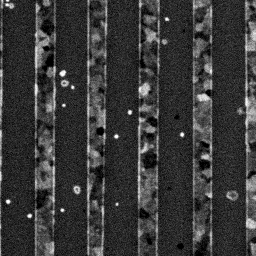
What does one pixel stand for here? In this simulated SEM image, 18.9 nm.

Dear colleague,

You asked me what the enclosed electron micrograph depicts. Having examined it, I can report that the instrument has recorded lines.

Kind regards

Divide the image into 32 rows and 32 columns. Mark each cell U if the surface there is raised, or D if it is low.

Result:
DDDDDUUDDDDUUDDDDDUUDDDDUUDDDDDU
DDDDDUUDDDDUUDDDDDUUDDDDUUDDDDDU
DDDDDUUDDDDUUDDDDDUUDDDDUUDDDDDU
DDDDDUUDDDDUUDDDDDUUDDDDUUDDDDDU
DDDDDUUDDDDUUDDDDDUUDDDDUUDDDDDU
DDDDDUUDDDDUUDDDDDUUDDDDUUDDDDDU
DDDDDUUDDDDUUDDDDDUUDDDDUUDDDDDU
DDDDDUUDDDDUUDDDDDUUDDDDUUDDDDDU
DDDDDUUDDDDUUDDDDDUUDDDDUUDDDDDU
DDDDDUUDDDDUUDDDDDUUDDDDUUDDDDDU
DDDDDUUDDDDUUDDDDDUUDDDDUUDDDDDU
DDDDDUUDDDDUUDDDDDUUDDDDUUDDDDDU
DDDDDUUDDDDUUDDDDDUUDDDDUUDDDDDU
DDDDDUUDDDDUUDDDDDUUDDDDUUDDDDDU
DDDDDUUDDDDUUDDDDDUUDDDDUUDDDDDU
DDDDDUUDDDDUUDDDDDUUDDDDUUDDDDDU
DDDDDUUDDDDUUDDDDDUUDDDDUUDDDDDU
DDDDDUUDDDDUUDDDDUUUDDDDUUDDDDDU
DDDDDUUDDDDUUDDDDUUUDDDDUUDDDDDU
DDDDDUUDDDDUUDDDDUUUDDDDUUDDDDDU
DDDDDUUDDDDUUDDDDUUUDDDDUUDDDDDU
DDDDDUUDDDDUUDDDDUUUDDDDUUDDDDDU
DDDDDUUDDDDUUDDDDUUUDDDDUUDDDDDU
DDDDDUUDDDDUUDDDDUUUDDDDUUDDDDDU
DDDDDUUDDDDUUDDDDUUUDDDDUUDDDDDU
DDDDDUUDDDDUUDDDDUUUDDDDUUDDDDDU
DDDDDUUDDDDUUDDDDUUUDDDDUUDDDDDU
DDDDDUUDDDDUUDDDDUUUDDDDUUDDDDDU
DDDDDUUDDDDUUDDDDUUUDDDDUUDDDDDU
DDDDDUUDDDDUUDDDDUUUDDDDUUDDDDDU
DDDDDUUDDDDUUDDDDUUUDDDDUUDDDDDU
DDDDDUUDDDDUUDDDDUUUDDDDUUDDDDDU